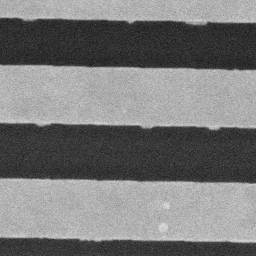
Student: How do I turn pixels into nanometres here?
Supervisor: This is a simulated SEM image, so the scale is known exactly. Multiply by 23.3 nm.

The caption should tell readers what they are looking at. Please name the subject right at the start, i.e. lines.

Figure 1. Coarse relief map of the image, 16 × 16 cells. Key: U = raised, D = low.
UUUUUUUUUUUUUUUU
DDDDDDDDDDDDDDDD
DDDDDDDDDDDDDDDD
DDDDDDDDDDDDDDDD
UUUUUUUUUUUUUUUU
UUUUUUUUUUUUUUUU
UUUUUUUUUUUUUUUU
UUUUUUUUUUUUUUUU
DDDDDDDDDDDDDDDD
DDDDDDDDDDDDDDDD
DDDDDDDDDDDDDDDD
UUUUUUUUUUUUUUUU
UUUUUUUUUUUUUUUU
UUUUUUUUUUUUUUUU
UUUUUUUUUUUUUUUU
DDDDDDDDDDDDDDDD